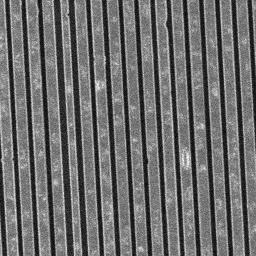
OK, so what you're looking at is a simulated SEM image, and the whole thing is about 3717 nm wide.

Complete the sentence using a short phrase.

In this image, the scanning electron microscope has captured parallel lines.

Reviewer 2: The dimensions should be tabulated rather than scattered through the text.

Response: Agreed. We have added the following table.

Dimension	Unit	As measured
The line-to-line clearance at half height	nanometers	77.9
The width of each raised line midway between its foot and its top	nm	152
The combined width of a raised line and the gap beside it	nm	234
